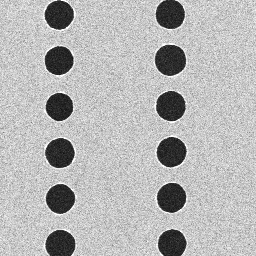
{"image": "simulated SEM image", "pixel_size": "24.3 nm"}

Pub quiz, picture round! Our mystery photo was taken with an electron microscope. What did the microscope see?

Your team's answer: a regular array of holes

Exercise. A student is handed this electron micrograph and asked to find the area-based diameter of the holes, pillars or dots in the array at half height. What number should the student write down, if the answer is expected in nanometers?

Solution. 728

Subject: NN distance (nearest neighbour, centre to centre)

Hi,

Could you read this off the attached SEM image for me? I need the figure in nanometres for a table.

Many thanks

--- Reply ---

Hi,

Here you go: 1120